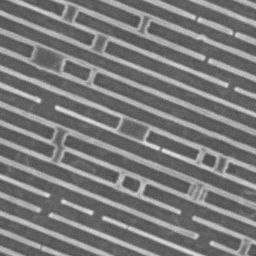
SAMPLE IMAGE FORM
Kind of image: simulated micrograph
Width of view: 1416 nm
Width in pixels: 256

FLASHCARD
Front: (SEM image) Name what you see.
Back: parallel lines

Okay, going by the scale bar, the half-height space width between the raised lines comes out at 0.0699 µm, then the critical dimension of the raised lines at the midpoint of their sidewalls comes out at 0.0218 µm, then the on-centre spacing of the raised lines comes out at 16.9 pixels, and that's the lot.